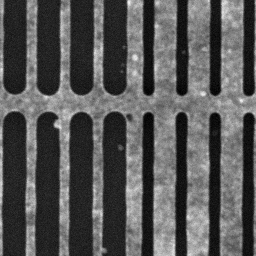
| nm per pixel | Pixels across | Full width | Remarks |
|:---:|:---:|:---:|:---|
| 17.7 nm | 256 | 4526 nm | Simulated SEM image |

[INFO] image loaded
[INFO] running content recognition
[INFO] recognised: groups of lines, slits or small figures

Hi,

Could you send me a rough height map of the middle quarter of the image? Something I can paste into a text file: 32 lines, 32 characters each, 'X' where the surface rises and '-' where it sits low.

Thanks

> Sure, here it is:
X-------X-------XXXX---XXXXX---X
X-------XX------XXX----XXXXX---X
X-------XX------XXX----XXXXX---X
X-------XX------XXX----XXXXX---X
X-------XX------XXX----XXXXX---X
X------XXX------XXX----XXXXX---X
XX-----XXX-----XXXX----XXXXX---X
XXX---XXXXX----XXXXX--XXXXXX---X
XXXXXXXXXXXXXXXXXXXXXXXXXXXXXXXX
XXXXXXXXXXXXXXXXXXXXXXXXXXXXXXXX
XXXXXXXXXXXXXXXXXXXXXXXXXXXXXXXX
XXXXXXXXXXXXXXXXXXXXXXXXXXXXXXXX
XXX---XXXXX----XXXXX--XXXXXX---X
XX-----XXX-----XXXX----XXXXX---X
X------XXX------XXX----XXXXX---X
X------XXX------XXX----XXXXX---X
X------XXX------XXX----XXXXX---X
X------XXX------XXX----XXXXX---X
X------XX-------XXX----XXXXX---X
X-------X-------XXX----XXXXX---X
X-------X-------XXX----XXXXX---X
X-------X-------XXX----XXXXX---X
X------XX-------XXX----XXXXX---X
X------XXX------XXX----XXXXX---X
X------XXX------XXX----XXXXX---X
X------XXX------XXX----XXXXX---X
X------XXX------XXX----XXXXX---X
X------XX-------XXX----XXXXX---X
X------XX-------XXX----XXXXX---X
X------XXX------XXX----XXXXX---X
X------XXX------XXX----XXXXX---X
X------XXX------XXX----XXXXX---X